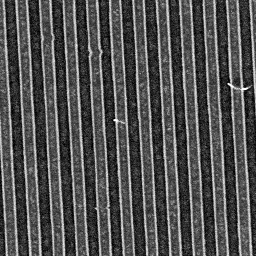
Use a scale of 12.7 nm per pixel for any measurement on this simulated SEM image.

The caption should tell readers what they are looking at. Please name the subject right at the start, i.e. parallel lines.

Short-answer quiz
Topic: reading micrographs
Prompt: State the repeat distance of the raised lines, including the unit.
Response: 23.4 px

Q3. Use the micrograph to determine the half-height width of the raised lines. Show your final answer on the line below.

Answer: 0.131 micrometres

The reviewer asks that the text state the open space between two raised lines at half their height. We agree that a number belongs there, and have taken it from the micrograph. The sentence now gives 0.166 um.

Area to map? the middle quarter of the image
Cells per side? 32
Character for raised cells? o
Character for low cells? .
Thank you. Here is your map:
.oo....oo...ooo...ooo...ooo...oo
.oo....oo....oo...ooo...ooo...oo
.oo....oo....oo...ooo...ooo...oo
.oo....oo....oo...ooo...ooo...oo
.oo....oo....oo....oo...ooo...oo
.oo....oo....oo....oo...ooo...oo
.oo....ooo...oo....oo...ooo...oo
.oo....ooo...oo....oo....oo...oo
.ooo...oo....oo....oo....oo...oo
.ooo...oo....oo....oo....oo...oo
.ooo...ooo...oo....oo....oo....o
.ooo...ooo...oo....oo....oo....o
.ooo...ooo...oo....oo....oo....o
.ooo...ooo...ooo...oo....oo....o
..oo...ooo...ooo...oo....oo....o
..oo...ooo...ooo...oo....oo....o
..oo...ooo...ooo...ooo...oo....o
..oo....oo...ooo...ooo...oo....o
..oo....oo...ooo...ooo...oo....o
..oo....oo...ooo...ooo...ooo...o
..oo....oo....oo...ooo...ooo...o
..oo....oo....oo...ooo...ooo...o
..ooo...oo....oo...ooo...ooo...o
..oo....oo....oo....oo...ooo...o
..oo....oo....oo....oo...ooo...o
..oo....ooo...oo....oo...ooo...o
..ooo...ooo...oo....oo....oo...o
..ooo...ooo...oo....oo....oo...o
..ooo...ooo...oo....oo....oo....
..ooo...ooo...oo....oo....oo....
..ooo...ooo...oo....oo....oo....
..ooo...ooo...oo....oo....oo....